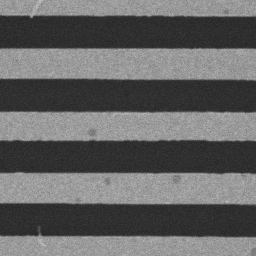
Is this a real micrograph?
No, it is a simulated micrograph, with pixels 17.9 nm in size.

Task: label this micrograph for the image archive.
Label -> lines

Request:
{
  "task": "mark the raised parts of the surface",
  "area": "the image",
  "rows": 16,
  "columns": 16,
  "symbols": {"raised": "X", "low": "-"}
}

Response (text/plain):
XXXXXXXXXXXXXXXX
----------------
----------------
XXXXXXXXXXXXXXXX
XXXXXXXXXXXXXXXX
----------------
----------------
XXXXXXXXXXXXXXXX
XXXXXXXXXXXXXXXX
----------------
----------------
XXXXXXXXXXXXXXXX
XXXXXXXXXXXXXXXX
----------------
----------------
XXXXXXXXXXXXXXXX